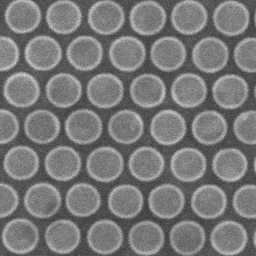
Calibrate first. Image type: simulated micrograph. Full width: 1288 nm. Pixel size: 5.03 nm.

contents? a regular array of raised bodies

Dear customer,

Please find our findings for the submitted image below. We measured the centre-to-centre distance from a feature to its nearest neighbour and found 41.3 pixels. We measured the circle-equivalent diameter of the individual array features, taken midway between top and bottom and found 32.7 pixels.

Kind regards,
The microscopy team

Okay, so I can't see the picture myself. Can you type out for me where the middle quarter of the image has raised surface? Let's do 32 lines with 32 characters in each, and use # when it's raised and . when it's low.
...#####.....######....######...
................................
................................
##......#####......####......###
###....#######....######....####
####..########...########..#####
####..########...########..#####
####..########...########..#####
####...#######...########...####
###....######.....######.....###
.........###....................
................................
..######.....#####......####....
.########...#######....######...
.########..########...########..
.########..########...########..
.########..########...########..
.########...#######...########..
..######.....#####.....######...
...###........###.......###.....
................................
##......####.......###........##
###....#######...#######....####
####..########...#######...#####
####..########..########...#####
####..########..########...#####
####..########...#######...#####
###....#######...#######....####
#.......#####......###.......###
................................
...####.........................
..######.....#####.....######...